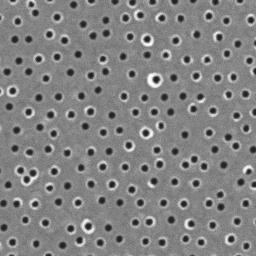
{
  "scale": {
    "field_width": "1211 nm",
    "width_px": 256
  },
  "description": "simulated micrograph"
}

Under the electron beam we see a regular array of holes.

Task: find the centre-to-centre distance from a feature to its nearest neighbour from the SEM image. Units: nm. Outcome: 79.1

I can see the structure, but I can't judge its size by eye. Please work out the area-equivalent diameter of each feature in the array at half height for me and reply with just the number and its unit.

36.2 nanometers